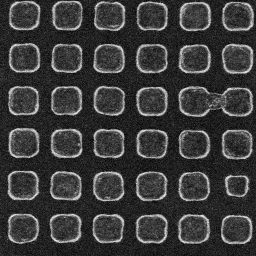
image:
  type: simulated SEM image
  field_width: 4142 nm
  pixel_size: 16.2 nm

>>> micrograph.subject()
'a regular array of raised bodies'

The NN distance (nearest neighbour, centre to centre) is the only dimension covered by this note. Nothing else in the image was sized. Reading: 683 nm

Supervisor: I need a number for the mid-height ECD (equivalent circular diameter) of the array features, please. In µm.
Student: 0.487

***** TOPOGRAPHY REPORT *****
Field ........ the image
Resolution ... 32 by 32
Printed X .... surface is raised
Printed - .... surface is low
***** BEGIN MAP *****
--XX---XXX--XXX---XX---XXX---XX-
-XXXX--XXX--XXXX-XXXX--XXX--XXX-
-XXXX--XXX--XXX--XXXX--XXX--XXX-
--XX---XX---XXX---XX---XXX--XXX-
--------------------------------
--------------------------------
-XXXX--XXX--XXX--XXXX--XXX--XXX-
-XXXX--XXX--XXX--XXXX-XXXX--XXX-
--XXX--XXX--XXX--XXXX--XXX--XXX-
--------------------------------
--------------------------------
-XXXX--XXX--XXX--XXXX--XXX--XXX-
-XXXX--XXX--XXX--XXXX-XXXXXXXXX-
-XXXX-XXXX--XXX--XXXX--XXXXXXXXX
--------------------------------
--------------------------------
--XX---XXX--XXX---XX---XX---XXX-
-XXXX--XXX--XXX--XXXX-XXXX--XXX-
-XXXX-XXXX--XXX--XXXX--XXX--XXX-
--XX---XX---XXX---XX---XX---XXX-
--------------------------------
--XX----------------------------
-XXXX--XXX--XXX--XXXX--XXX--XXX-
-XXXX-XXXX--XXX--XXXX-XXXX--XXX-
-XXX---XXX--XXX--XXX---XXX------
--------------------------------
--------------------------------
-XXX---XXX--XXX--XXXX--XXX--XXX-
-XXXX-XXXX--XXX--XXXX-XXXX--XXX-
-XXXX--XXX--XXX--XXXX-XXXX--XXX-
--------------------------------
--------------------------------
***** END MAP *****